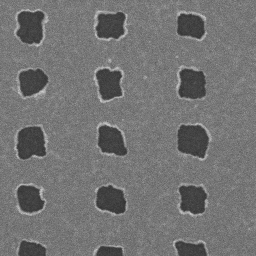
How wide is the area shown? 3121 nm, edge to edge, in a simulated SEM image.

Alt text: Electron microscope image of a regular array of holes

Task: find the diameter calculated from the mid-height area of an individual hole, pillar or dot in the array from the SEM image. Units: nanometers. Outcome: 364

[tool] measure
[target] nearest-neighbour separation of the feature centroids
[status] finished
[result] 692 nm